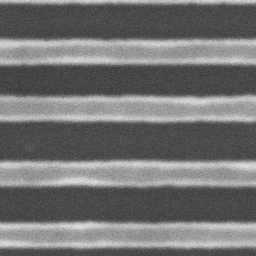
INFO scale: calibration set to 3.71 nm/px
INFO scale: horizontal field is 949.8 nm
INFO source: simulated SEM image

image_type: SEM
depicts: lines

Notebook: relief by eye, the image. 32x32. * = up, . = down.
................................
................................
................................
................................
................................
********************************
********************************
********************************
................................
................................
................................
................................
********************************
********************************
********************************
................................
................................
................................
................................
................................
*******************************.
********************************
********************************
................................
................................
................................
................................
................................
********************************
********************************
********************************
................................